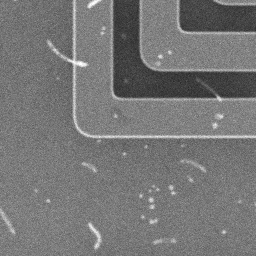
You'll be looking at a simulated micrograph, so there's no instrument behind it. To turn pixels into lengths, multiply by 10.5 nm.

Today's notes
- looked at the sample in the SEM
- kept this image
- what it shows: groups of lines, slits or small figures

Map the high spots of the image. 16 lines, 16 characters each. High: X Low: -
-----XX--XX-----
-----XX--XX-----
-----XX--XXXXXXX
-----XX--XXXXXXX
-----XX---------
-----XX---------
-----XXXXXXXXXXX
-----XXXXXXXXXXX
------XXXXXXXXXX
----------------
----------------
----------------
----------------
----------------
----------------
----------------